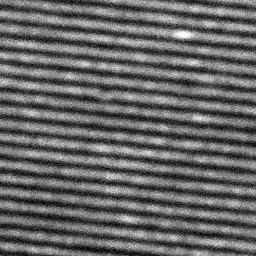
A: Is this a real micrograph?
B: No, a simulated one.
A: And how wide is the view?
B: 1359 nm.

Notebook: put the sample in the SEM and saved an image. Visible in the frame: parallel lines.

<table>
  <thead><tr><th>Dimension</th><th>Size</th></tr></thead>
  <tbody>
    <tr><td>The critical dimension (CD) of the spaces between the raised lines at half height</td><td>0.0402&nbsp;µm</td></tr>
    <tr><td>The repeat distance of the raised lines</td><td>71.9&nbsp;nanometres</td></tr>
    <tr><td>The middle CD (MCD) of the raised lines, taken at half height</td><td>30.3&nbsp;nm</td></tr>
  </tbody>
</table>